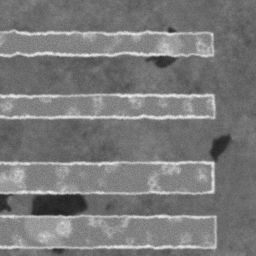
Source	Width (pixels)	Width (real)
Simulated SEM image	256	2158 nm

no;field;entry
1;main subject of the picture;one or a few lines or trenches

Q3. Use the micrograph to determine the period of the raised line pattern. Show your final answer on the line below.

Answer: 528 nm